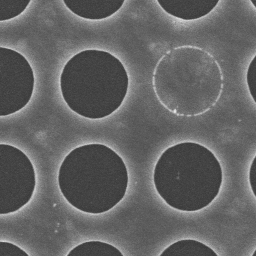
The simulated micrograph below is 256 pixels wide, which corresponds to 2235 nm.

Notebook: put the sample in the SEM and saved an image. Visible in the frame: holes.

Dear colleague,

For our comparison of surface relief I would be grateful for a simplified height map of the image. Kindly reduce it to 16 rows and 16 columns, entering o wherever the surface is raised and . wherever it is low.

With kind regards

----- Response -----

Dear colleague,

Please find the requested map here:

..oo...ooo...ooo
oooooooooooooooo
oooooooooooooooo
.oooo..ooooooooo
..oo....ooooooo.
..oo....oooooooo
..oo....oooooooo
oooooooooooooooo
oooooooooooooooo
.ooo...ooo...ooo
..oo....oo....oo
..oo....oo....oo
..oo...ooo...ooo
oooooooooooooooo
oooooooooooooooo
.oooo..ooo...ooo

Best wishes